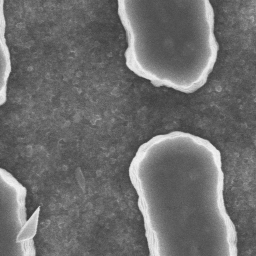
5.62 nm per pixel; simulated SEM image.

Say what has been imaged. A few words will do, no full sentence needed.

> raised bodies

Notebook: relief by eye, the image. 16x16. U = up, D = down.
DDDDDDDDUUUUUDDD
DDDDDDDDUUUUUDDD
DDDDDDDDUUUUUDDD
UDDDDDDDUUUUUDDD
UDDDDDDDDUUUUDDD
DDDDDDDDDDDDDDDD
DDDDDDDDDDDDDDDD
DDDDDDDDDDDDDDDD
DDDDDDDDDDUUDDDD
DDDDDDDDDUUUUDDD
DDDDDDDDUUUUUUDD
UDDDDDDDUUUUUUDD
UDDDDDDDDUUUUUDD
UUDDDDDDDUUUUUDD
UUDDDDDDDUUUUUDD
UUDDDDDDDDUUUUUD